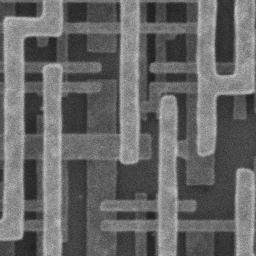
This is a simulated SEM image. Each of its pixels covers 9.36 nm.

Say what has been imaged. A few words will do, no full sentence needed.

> wiring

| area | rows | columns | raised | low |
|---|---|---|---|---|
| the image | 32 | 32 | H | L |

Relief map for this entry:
LLLLLHHHLLLLLLLHHLLLLLLLLHHLLHHH
LLLLLHHHLLLLLLLHHLLLLLLLLHHLLHHH
LHHHHHHHLLLLLLLHHLLLLLLLLHHLLHHH
LHHHHHHHLLLLLLLHHLLLLLLLLHHLLHHH
LHHHLLHLLLLLLLLHHLLLLLLLLHHLLLHH
LHHLLLLLLLLLLLLHHLLLLLLLLHHLLLHH
LHHLLLLLLLLLLLLHHLLLLLLLLHHLLLHH
LHHLLLLLLLLLLLLHHLLLLLLLLHHLLHHH
LHHLLLHHLLLLLLLHHLLLLLLLLHHLLHHH
LHHLLHHHLLLLLLLHHLLLLLLLLHHHHHHH
LHHLLHHHLLLLLLLHHLLLLLLLLHHHHHHH
LHHLLHHHLLLLLLLHHLLLLLLLLHHHHHHH
LHHLLHHHLLLLLLLHHLLLHHLLLHHLLLLL
LHHLLHHHLLLLLLLHHLLLHHLLLHHLLLLL
LHHLLLHHLLLLLLLHHLLLHHLLLHHLLLLL
LHHLLLHHLLLLLLLHHLLLHHLLLHHLLLLL
LHHLLLHHLLLLLLLHHLLLHHLLLHHLLLLL
LHHLLLHHLLLLLLLHHLLLHHLLLHHLLLLL
LHHLLHHHLLLLLLLHHLLLHHLLLHHLLLLL
LHHLLHHHLLLLLLLHHLLLHHLLLHLLLLLL
LHHLLHHHLLLLLLLLLLLLHHLLLLLLLLLL
LHHLLHHHLLLLLLLLLLLLHHLLLLLLLLHH
LHHLLHHHLLLLLLLLLLLLHHLLLLLLLLHH
LHHLLHHHLLLLLLLLLLLLHHLLLLLLLLHH
LHHLLHHHLLLLLLLLLLLLHHLLLLLLLHHH
HHHLLLHHLLLLLLLLLLLLHHLLLLLLLHHH
HHHLLLHHLLLLLLLLLLLLHHLLLLLLLLHH
HHHLLLHHLLLLLLLLLLLLHHLLLLLLLLHH
HHHLLLHHLLLLLLLLLLLLHHLLLLLLLLHH
HHHLLHHHLLLLLLLLLLLLHHLLLLLLLLHH
LLLLLHHHLLLLLLLLLLLLHHLLLLLLLLHH
LLLLLHHHLLLLLLLLLLLLHHLLLLLLLLHH